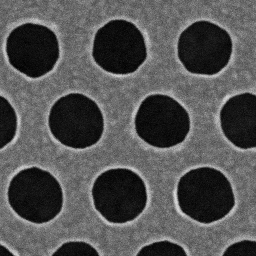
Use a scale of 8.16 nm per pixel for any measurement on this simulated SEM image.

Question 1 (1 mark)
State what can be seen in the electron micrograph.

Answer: a regular array of holes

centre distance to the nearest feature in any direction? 688 nanometres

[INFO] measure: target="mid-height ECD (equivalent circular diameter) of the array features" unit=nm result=448